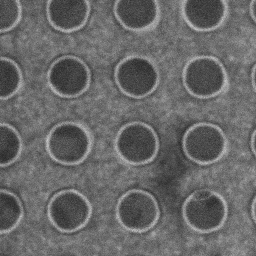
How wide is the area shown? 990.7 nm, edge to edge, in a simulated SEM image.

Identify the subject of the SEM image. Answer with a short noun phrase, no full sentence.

a regular array of raised bodies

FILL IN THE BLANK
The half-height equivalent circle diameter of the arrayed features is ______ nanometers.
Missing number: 161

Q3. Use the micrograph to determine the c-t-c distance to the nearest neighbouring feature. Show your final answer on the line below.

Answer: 260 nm